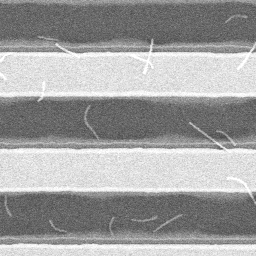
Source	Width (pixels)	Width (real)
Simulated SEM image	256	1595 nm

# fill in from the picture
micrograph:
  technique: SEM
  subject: lines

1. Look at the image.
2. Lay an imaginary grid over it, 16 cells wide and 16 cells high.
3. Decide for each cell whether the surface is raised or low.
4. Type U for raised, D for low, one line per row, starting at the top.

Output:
DDDDDDDDDDDDDDDD
DDDDDDDDDDDDDDDD
DDDDDDDDDDDDDDDD
UUUUUUUUUUUUUUUU
UUUUUUUUUUUUUUUU
UUUUUUUUUUUUUUUU
DDDDDDDDDDDDDDDD
DDDDDDDDDDDDDDDD
DDDDDDDDDDDDDDDD
UUUUUUUUUUUUUUUU
UUUUUUUUUUUUUUUU
UUUUUUUUUUUUUUUU
DDDDDDDDDDDDDDDD
DDDDDDDDDDDDDDDD
DDDDDDDDDDDDDDDD
UUUUUUUUUUUUUUUU